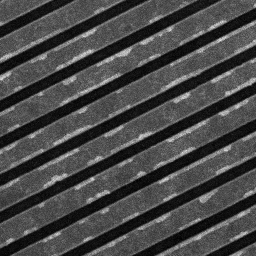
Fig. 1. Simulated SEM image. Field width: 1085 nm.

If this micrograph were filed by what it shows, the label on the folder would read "parallel lines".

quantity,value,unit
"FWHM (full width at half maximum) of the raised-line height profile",91.8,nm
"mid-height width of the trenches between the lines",47.8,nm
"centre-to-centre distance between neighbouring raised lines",140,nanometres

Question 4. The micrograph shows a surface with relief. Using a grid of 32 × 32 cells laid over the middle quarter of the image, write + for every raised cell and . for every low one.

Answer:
+......++++++++++++.......++++++
.....++++++++++++.......++++++++
...++++++++++++.......++++++++++
.++++++++++++.......+++++++++++.
+++++++++++.......+++++++++++...
+++++++++.......+++++++++++.....
+++++++.......+++++++++++.......
+++++.......+++++++++++.......++
+++.......++++++++++++......++++
+.......+++++++++++.......++++++
......+++++++++++.......++++++++
....+++++++++++.......++++++++++
..+++++++++++.......++++++++++++
++++++++++++......++++++++++++..
+++++++++.......++++++++++++....
+++++++.......++++++++++++......
+++++.......++++++++++++......++
+++.......++++++++++++......++++
+.......++++++++++++......++++++
......++++++++++++.......+++++++
....++++++++++++......++++++++++
..++++++++++++.......+++++++++++
++++++++++++.......+++++++++++..
++++++++++.......+++++++++++....
++++++++.......++++++++++++.....
++++++.......+++++++++++.......+
++++.......+++++++++++.......+++
++.......+++++++++++.......+++++
.......+++++++++++.......+++++++
.....++++++++++++.......++++++++
...++++++++++++......+++++++++++
.++++++++++++......++++++++++++.